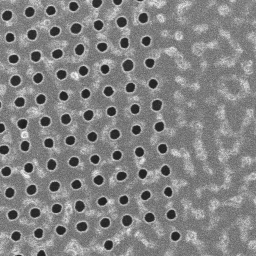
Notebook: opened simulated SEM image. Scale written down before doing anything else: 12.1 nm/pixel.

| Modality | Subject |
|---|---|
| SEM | a regular array of holes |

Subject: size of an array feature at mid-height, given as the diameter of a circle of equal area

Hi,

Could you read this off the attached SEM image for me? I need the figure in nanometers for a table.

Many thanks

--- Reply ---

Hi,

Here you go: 120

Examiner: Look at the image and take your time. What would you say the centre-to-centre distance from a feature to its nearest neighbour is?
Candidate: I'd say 259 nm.